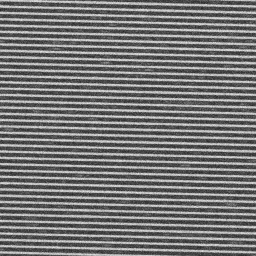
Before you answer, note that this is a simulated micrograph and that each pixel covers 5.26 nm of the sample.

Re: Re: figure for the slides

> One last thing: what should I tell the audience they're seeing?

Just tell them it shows parallel lines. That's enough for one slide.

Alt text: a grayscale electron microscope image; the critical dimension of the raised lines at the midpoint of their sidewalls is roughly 9.9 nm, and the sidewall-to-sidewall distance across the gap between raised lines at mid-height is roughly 23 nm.